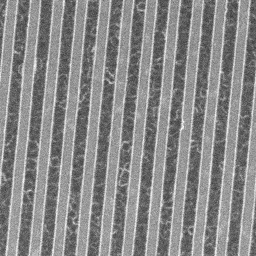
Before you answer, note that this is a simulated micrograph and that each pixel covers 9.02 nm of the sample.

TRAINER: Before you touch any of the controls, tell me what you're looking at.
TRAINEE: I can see parallel lines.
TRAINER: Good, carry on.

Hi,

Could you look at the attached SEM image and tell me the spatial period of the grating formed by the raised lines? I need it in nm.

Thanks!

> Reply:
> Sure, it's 209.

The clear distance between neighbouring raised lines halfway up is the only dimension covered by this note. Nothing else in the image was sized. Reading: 85.3 nm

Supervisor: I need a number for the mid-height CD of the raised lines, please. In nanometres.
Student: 122